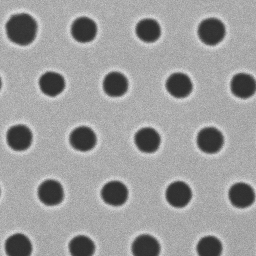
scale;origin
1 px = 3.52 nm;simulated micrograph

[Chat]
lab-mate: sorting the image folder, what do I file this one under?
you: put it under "a regular array of holes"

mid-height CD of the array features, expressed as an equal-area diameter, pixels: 24.6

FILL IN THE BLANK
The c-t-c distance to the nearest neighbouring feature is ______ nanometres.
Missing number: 221